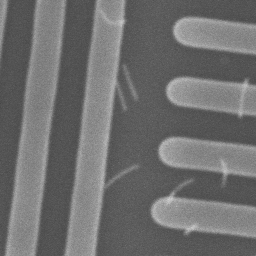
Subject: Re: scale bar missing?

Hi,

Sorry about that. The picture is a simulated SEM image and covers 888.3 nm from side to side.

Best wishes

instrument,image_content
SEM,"groups of lines, slits or small figures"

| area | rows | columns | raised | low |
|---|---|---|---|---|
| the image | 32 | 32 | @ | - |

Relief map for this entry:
@----@@@----@@@@----------------
@----@@@----@@@-----------------
@---@@@@----@@@--------@@@------
----@@@@----@@@-------@@@@@@@@@@
----@@@@----@@@-------@@@@@@@@@@
----@@@@---@@@@--------@@@@@@@@@
----@@@----@@@@----------------@
----@@@----@@@@-----------------
----@@@----@@@@-----------------
----@@@----@@@@-----------------
---@@@@----@@@-------@@@@@@@@@@-
---@@@@----@@@-------@@@@@@@@@@@
---@@@@----@@@-------@@@@@@@@@@@
---@@@@----@@@-----------@@@@@@@
---@@@----@@@@------------------
---@@@----@@@@------------------
---@@@----@@@@------------------
---@@@----@@@--------@@@@-------
--@@@@----@@@-------@@@@@@@@@@@@
--@@@@----@@@-------@@@@@@@@@@@@
--@@@@----@@@--------@@@@@@@@@@@
--@@@@----@@@---------------@@@@
--@@@@---@@@@-------------------
--@@@----@@@@-------------------
--@@@----@@@@-------------------
--@@@----@@@@------@@@@@@@@@----
-@@@@----@@@-------@@@@@@@@@@@@@
-@@@@----@@@-------@@@@@@@@@@@@@
-@@@@----@@@-----------@@@@@@@@@
-@@@@---@@@@-------------------@
-@@@@---@@@@--------------------
-@@@----@@@@--------------------